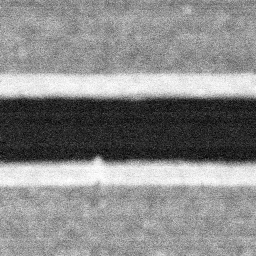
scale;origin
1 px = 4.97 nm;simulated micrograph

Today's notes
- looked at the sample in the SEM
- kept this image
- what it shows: one or a few lines or trenches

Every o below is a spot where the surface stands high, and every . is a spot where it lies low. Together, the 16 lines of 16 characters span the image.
oooooooooooooooo
oooooooooooooooo
oooooooooooooooo
oooooooooooooooo
oooooooooooooooo
................
................
................
................
................
................
oooooooooooooooo
oooooooooooooooo
oooooooooooooooo
oooooooooooooooo
oooooooooooooooo